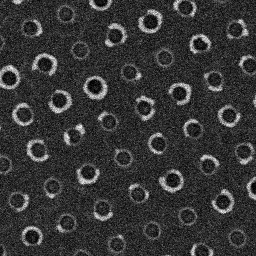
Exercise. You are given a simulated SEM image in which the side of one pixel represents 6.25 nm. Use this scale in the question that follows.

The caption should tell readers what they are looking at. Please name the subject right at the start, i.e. a regular array of holes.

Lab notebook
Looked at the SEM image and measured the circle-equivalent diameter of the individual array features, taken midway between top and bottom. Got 14.8 pixels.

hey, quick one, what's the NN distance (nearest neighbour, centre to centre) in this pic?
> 237 nanometres